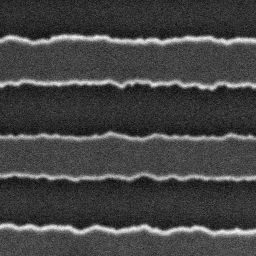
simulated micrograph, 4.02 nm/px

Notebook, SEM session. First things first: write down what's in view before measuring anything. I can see lines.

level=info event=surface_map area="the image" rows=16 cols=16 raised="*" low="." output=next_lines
................
................
**.*************
****************
****************
................
................
................
****..**.**...*.
****************
****************
................
................
................
****************
****************